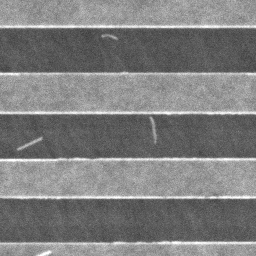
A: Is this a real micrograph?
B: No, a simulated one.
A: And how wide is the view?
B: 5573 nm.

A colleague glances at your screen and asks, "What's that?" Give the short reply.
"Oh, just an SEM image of lines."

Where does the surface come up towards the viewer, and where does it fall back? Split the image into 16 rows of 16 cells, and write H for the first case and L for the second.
HHHHHHHHHHHHHHHH
HHHHHHHHHHHHHHHH
LLLLLLLLLLLLLLLL
LLLLLLLLLLLLLLLL
LLLLLLLLLLLLLLLL
HHHHHHHHHHHHHHHH
HHHHHHHHHHHHHHHH
LLLLLLLLLLLLLLLL
LLLLLLLLLLLLLLLL
LLLLLLLLLLLLLLLL
HHHHHHHHHHHHHHHH
HHHHHHHHHHHHHHHH
LLLLLLLLLLLLLLLL
LLLLLLLLLLLLLLLL
LLLLLLLLLLLLLLLL
HHHHHHHHHHHHHHHH